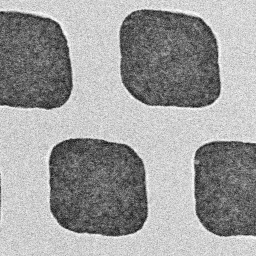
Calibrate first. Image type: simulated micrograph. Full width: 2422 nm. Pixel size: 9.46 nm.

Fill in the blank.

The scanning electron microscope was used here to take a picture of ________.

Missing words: holes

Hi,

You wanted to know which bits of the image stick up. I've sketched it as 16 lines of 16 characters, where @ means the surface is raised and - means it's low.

@@@@@@@@@@@@@@@@
----@@@@-----@@@
----@@@-------@@
----@@@@------@@
-----@@@------@@
-----@@@------@@
----@@@@@----@@@
@@@@@@@@@@@@@@@@
@@@@@@@@@@@@@@@@
@@@-----@@@@----
@@@------@@@----
@@@------@@@----
@@@------@@@----
@@@------@@@----
@@@@@---@@@@@---
@@@@@@@@@@@@@@@@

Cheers